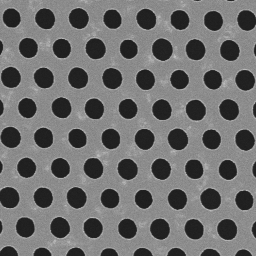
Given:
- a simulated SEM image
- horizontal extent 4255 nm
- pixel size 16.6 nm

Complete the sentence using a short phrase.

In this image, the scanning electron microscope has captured a regular array of holes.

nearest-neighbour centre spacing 553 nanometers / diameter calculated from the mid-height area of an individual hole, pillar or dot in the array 334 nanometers